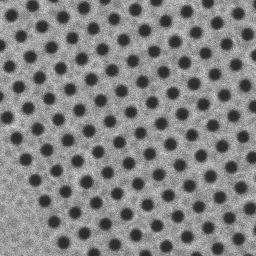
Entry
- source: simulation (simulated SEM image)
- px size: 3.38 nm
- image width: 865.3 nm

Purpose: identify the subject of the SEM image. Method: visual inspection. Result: a regular array of holes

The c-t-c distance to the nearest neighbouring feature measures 22.7 px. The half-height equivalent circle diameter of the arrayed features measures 42.4 nm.